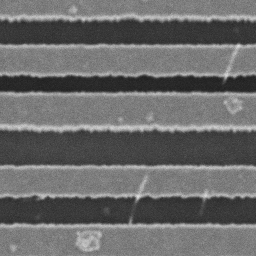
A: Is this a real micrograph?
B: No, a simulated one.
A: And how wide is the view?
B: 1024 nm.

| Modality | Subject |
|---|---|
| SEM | lines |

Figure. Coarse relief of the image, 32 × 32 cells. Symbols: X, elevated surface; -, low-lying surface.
XXXXXXXXXXXXXXXXXXXXXXXXXXXXXXXX
XXXXXXXXXXXXXXXXXXXXXXXXXXXXXXXX
-X------XXX-X----X--X----X-----X
--------------------------------
--------------------------------
--------------------------------
XXXXXXXXXXXXXXXXXXXXXXXXXXXXXXXX
XXXXXXXXXXXXXXXXXXXXXXXXXXXXXXXX
XXXXXXXXXXXXXXXXXXXXXXXXXXXXXXXX
-X--XXXX--XXX-XXX--XXX--XXXXXX--
--------------------------------
----X-----------X-------X-------
XXXXXXXXXXXXXXXXXXXXXXXXXXXXXXXX
XXXXXXXXXXXXXXXXXXXXXXXXXXXXXXXX
XXXXXXXXXXXXXXXXXXXXXXXXXXXXXXXX
XXXXXXXXXXXXXXXXXXXXXXXXXXXXXXXX
--------------------------------
--------------------------------
--------------------------------
--------------------------------
--------------------------------
XXXXXXXXXXXXXXXXXXXXXXXXXXXXXXXX
XXXXXXXXXXXXXXXXXXXXXXXXXXXXXXXX
XXXXXXXXXXXXXXXXXXXXXXXXXXXXXXXX
XXXX-XXXXXXXXXXXXX-XXXXXXXXXXXXX
--------------------------------
--------------------------------
--------------------------------
XXXXXXXXXXXXXXXXXXXXXXXXXXXXXXXX
XXXXXXXXXXXXXXXXXXXXXXXXXXXXXXXX
XXXXXXXXXXXXXXXXXXXXXXXXXXXXXXXX
XXXXXXXXXXXXXXXXXXXXXXXXXXXXXXXX